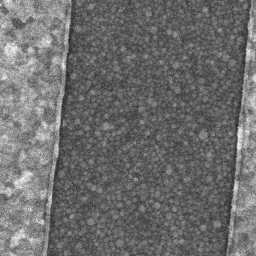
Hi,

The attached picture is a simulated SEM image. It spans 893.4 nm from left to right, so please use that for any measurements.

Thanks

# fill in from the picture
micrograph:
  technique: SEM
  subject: one or a few lines or trenches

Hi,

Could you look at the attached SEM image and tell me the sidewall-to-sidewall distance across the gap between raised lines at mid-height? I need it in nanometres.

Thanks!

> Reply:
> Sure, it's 624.